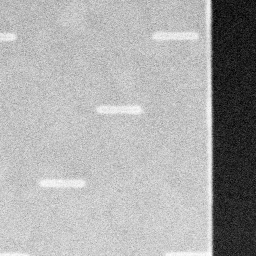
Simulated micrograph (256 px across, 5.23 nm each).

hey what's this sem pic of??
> wiring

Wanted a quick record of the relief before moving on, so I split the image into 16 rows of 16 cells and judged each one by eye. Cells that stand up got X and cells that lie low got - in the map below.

XXXXXXXXXXXXX---
XXXXXXXXXXXXX---
XXXXXXXXXXXXX---
XXXXXXXXXXXXX---
XXXXXXXXXXXXX---
XXXXXXXXXXXXX---
XXXXXXXXXXXXX---
XXXXXXXXXXXXX---
XXXXXXXXXXXXX---
XXXXXXXXXXXXX---
XXXXXXXXXXXXX---
XXXXXXXXXXXXX---
XXXXXXXXXXXXX---
XXXXXXXXXXXXX---
XXXXXXXXXXXXX---
XXXXXXXXXXXXX---